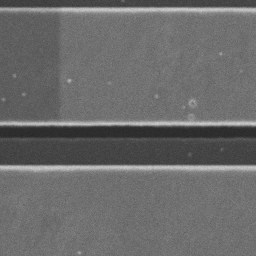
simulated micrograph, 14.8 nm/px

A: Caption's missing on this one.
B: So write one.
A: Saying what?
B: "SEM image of lines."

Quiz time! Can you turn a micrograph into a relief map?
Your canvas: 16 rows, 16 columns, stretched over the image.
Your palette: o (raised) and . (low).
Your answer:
................
oooooooooooooooo
oooooooooooooooo
oooooooooooooooo
oooooooooooooooo
oooooooooooooooo
oooooooooooooooo
oooooooooooooooo
................
................
oooooooooooooooo
oooooooooooooooo
oooooooooooooooo
oooooooooooooooo
oooooooooooooooo
oooooooooooooooo